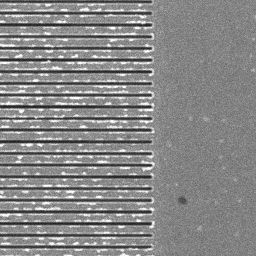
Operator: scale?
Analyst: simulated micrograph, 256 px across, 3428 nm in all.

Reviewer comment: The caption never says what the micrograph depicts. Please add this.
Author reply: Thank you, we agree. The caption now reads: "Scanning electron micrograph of parallel lines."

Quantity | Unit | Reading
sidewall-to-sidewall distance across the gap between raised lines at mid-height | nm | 45.2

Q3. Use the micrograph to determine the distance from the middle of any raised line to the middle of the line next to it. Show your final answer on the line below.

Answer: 157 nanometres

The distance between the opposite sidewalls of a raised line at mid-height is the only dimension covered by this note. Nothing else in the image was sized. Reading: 0.114 um